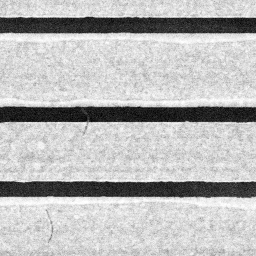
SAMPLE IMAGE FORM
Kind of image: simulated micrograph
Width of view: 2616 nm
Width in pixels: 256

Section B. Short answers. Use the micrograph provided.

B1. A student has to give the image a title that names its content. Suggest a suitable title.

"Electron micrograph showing lines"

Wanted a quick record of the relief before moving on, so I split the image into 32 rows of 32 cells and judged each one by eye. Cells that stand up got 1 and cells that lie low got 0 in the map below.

11111111111111111111111111111111
11111111111111111111111111111111
00000000000000000000000000000000
00000000000000000000000000000000
00000000000000000000000000000000
11111111111111111111111111111111
11111111111111111111111111111111
11111111111111111111111111111111
11111111111111111111111111111111
11111111111111111111111111111111
11111111111111111111111111111111
11111111111111111111111111111111
11111111111111111111111111111111
00000000000000000000000000000000
00000000000000000000000000000000
11111111111111111111111111111111
11111111111111111111111111111111
11111111111111111111111111111111
11111111111111111111111111111111
11111111111111111111111111111111
11111111111111111111111111111111
11111111111111111111111111111111
11111111111111111111111111111111
00000000000000000000000000000000
00000000000000000000000000000000
11111111111111111111111111111111
11111111111111111111111111111111
11111111111111111111111111111111
11111111111111111111111111111111
11111111111111111111111111111111
11111111111111111111111111111111
11111111111111111111111111111111